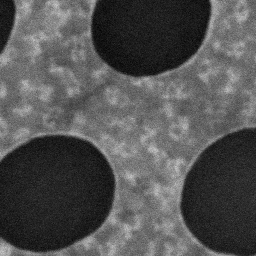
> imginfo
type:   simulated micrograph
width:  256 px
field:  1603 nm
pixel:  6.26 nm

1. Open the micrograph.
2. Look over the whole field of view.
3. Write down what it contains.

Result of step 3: holes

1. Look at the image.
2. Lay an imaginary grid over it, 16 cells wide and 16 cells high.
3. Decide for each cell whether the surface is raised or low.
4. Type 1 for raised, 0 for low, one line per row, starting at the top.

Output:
0111110000000111
0111110000000111
0111110000000111
1111110000001111
1111111000111111
1111111111111111
1111111111111111
1111111111111111
1110011111111100
1000001111111000
0000000111110000
0000000111100000
0000000111100000
0000000111100000
0000001111110000
1000111111111000